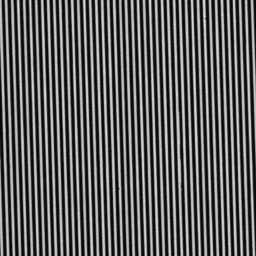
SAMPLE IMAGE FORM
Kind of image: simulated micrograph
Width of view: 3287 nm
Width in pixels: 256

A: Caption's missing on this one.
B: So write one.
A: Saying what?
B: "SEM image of parallel lines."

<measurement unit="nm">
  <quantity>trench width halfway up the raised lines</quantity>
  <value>46.5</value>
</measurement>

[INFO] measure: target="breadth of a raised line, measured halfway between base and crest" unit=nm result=35.3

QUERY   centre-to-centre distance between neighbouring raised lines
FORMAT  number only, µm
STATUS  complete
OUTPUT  0.077